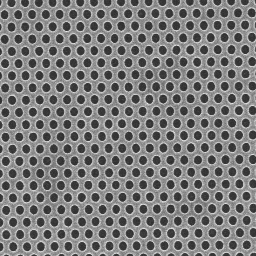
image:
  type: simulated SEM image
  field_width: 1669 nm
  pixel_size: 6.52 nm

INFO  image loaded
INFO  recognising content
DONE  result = a regular array of holes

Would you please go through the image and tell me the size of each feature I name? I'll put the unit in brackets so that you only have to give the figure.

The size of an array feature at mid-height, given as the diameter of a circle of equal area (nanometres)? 56.5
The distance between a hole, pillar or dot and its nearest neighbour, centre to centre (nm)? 88.8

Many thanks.